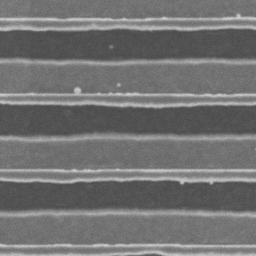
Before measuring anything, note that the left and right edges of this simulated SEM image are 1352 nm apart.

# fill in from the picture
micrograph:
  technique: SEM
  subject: lines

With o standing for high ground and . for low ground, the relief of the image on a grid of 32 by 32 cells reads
oooooooooooooooooooooooooooooooo
oooooooooooooooooooooooooooooooo
oooooooooooooooooooooooooooooooo
oooooooooooooooooooooooooooo.o.o
................................
................................
................................
................................
oooooooooooooooooooooooooooooooo
oooooooooooooooooooooooooooooooo
oooooooooooooooooooooooooooooooo
oooooooooooooooooooooooooooooooo
oooooooooooooooooooooooooooooooo
................................
................................
................................
................................
ooo.oooo.ooooooooooooooooooooooo
oooooooooooooooooooooooooooooooo
oooooooooooooooooooooooooooooooo
oooooooooooooooooooooooooooooooo
oooooooooooooooooooooooooooooooo
ooooooooooooo.oo......oooooooooo
................................
................................
................................
................................
oooooooooooooooooooooooooooooooo
oooooooooooooooooooooooooooooooo
oooooooooooooooooooooooooooooooo
oooooooooooooooooooooooooooooooo
oooooooooooooooooooooooooooooooo